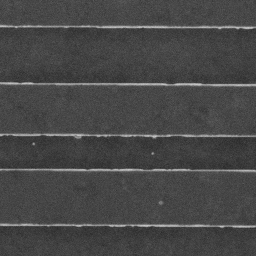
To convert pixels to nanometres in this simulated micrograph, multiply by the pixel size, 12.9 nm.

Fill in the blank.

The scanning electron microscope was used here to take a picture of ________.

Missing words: lines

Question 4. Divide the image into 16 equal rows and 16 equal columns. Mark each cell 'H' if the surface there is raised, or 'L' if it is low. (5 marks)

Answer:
HHHHHHHHHHHHHHHH
HHHHHHHHHHHHHHHH
LLLLLLLLLLLLLLLL
LLLLLLLLLLLLLLLL
LLLLLLLLLLLLLLLL
HHHHHHHHHHHHHHHH
HHHHHHHHHHHHHHHH
HHHHHHHHHHHHHHHH
LLLLLLHHHHHHHHHH
LLLLLLLLLLLLLLLL
LLLLLLLLLLLLLLLL
HHHHHHHHHHHHHHHH
HHHHHHHHHHHHHHHH
HHHHHHHHHHHHHHHH
LLLLLLLLLLLLLLLL
LLLLLLLLLLLLLLLL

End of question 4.